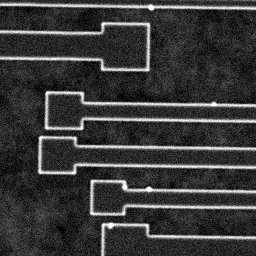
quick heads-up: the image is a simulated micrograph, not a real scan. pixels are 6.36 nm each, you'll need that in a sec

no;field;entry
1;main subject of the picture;groups of lines, slits or small figures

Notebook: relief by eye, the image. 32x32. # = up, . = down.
################################
................................
................................
.............######.............
###################.............
###################.............
###################.............
............#######.............
.............######.............
................................
................................
................................
......####......................
......##########################
......##########################
......####......................
................................
.....####.......................
.....###################........
.....###########################
.....###########################
.....####.......................
................................
...........#####................
...........#####################
...........#####################
...........#####................
................................
.............######.............
.............#######............
.............###################
.............###################